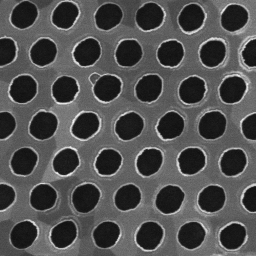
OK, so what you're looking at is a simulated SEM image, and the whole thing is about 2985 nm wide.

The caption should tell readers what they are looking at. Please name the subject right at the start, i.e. a regular array of holes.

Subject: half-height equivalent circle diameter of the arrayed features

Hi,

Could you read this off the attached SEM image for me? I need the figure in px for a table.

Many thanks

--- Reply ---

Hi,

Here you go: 27.3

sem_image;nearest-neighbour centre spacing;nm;480